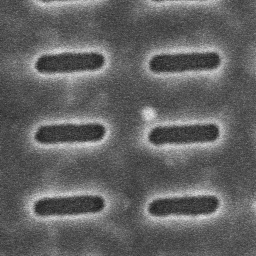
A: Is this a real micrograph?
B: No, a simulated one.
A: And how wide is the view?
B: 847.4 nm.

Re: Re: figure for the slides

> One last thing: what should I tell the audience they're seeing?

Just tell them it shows holes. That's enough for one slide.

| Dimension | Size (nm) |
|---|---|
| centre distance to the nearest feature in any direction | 238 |